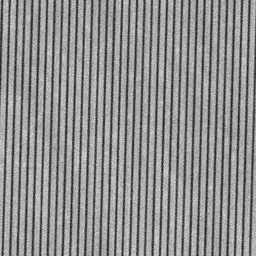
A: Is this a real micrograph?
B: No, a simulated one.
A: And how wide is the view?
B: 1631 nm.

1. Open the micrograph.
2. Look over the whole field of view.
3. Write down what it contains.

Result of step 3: parallel lines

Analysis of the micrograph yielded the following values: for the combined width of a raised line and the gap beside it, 47.7 nanometers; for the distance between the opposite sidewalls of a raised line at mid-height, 35 nanometres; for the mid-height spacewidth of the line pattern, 1.87 pixels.